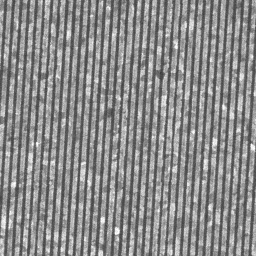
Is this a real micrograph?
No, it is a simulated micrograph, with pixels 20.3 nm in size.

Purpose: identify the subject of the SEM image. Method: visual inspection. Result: parallel lines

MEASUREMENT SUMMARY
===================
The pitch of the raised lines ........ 155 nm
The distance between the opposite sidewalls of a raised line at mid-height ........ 83.5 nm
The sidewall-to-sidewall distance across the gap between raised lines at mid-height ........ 70.8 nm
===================